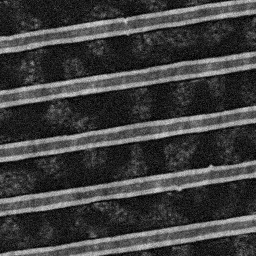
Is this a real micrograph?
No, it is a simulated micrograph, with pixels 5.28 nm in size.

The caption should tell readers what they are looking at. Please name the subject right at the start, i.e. parallel lines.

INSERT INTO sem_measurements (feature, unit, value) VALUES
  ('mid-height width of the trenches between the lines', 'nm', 217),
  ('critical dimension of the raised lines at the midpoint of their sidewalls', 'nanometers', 64.6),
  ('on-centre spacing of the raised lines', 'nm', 284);